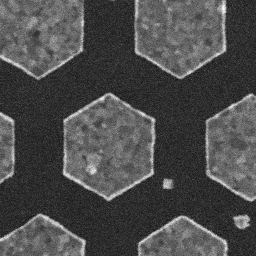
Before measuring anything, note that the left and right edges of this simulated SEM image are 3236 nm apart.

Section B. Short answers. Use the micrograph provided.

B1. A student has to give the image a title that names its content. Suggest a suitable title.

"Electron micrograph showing raised bodies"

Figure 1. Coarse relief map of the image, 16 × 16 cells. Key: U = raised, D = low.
UUUUUDDDDUUUUUDD
UUUUUDDDDUUUUUDD
UUUUUDDDDUUUUUDD
UUUUUDDDDUUUUDDD
DDUDDDDDDDDUDDDD
DDDDDDDDDDDDDDDD
DDDDDDUUDDDDDDDU
UDDDUUUUUDDDDUUU
UDDDUUUUUUDDDUUU
UDDDUUUUUUDDDUUU
UDDDUUUUUUDDDUUU
DDDDDUUUDDDDDDUU
DDDDDDDDDDDDDDDD
DDDDDDDDDDDDDDDD
DUUUDDDDDDUUUDDD
UUUUUDDDDUUUUUDD